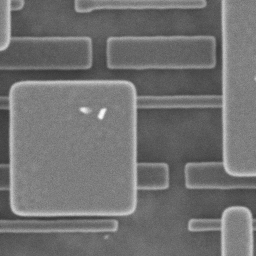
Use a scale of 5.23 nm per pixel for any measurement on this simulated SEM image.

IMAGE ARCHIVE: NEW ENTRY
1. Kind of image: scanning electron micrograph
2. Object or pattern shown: wiring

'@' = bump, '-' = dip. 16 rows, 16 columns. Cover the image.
@-------------@@
@-------------@@
@-------------@@
--------------@@
--------------@@
-@@@@@@@------@@
-@@@@@@@------@@
-@@@@@@@------@@
-@@@@@@@------@@
-@@@@@@@------@@
-@@@@@@@------@@
-@@@@@@@--------
-@@@@@@@--------
--------------@@
--------------@@
--------------@@